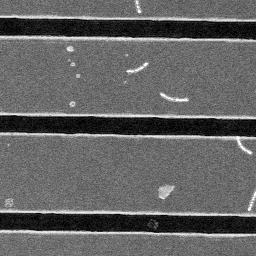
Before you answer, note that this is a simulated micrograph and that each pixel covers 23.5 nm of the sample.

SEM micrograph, lines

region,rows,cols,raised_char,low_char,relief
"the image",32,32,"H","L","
HHHHHHHHHHHHHHHHHHHHHHHHHHHHHHHH
HHHHHHHHHHHHHHHHHHHHHHHHHHHHHHHH
LLLLLLLLLLLLLLLLLLLLLLLLLLHHHHHH
LLLLLLLLLLLLLLLLLLLLLLLLLLLLLLLL
LLLLLLLLLLLLLLLLLLLLLLLLLLLLLLLL
HHHHHHHHHHHHHHHHHHHHHHHHHHHHHHHH
HHHHHHHHHHHHHHHHHHHHHHHHHHHHHHHH
HHHHHHHHHHHHHHHHHHHHHHHHHHHHHHHH
HHHHHHHHHHHHHHHHHHHHHHHHHHHHHHHH
HHHHHHHHHHHHHHHHHHHHHHHHHHHHHHHH
HHHHHHHHHHHHHHHHHHHHHHHHHHHHHHHH
HHHHHHHHHHHHHHHHHHHHHHHHHHHHHHHH
HHHHHHHHHHHHHHHHHHHHHHHHHHHHHHHH
HHHHHHHHHHHHHHHHHHHHHHHHHHHHHHHH
LLLLLLLLLLLLLHHHHHHHHHHHHHHHHHHH
LLLLLLLLLLLLLLLLLLLLLLLLLLLLLLLL
LLLLLLLLLLLLLLLLLLLLLLLLLLLLLLLL
HHHHHHHHHHHHHHHHHHHHHHHHHHHHHHHH
HHHHHHHHHHHHHHHHHHHHHHHHHHHHHHHH
HHHHHHHHHHHHHHHHHHHHHHHHHHHHHHHH
HHHHHHHHHHHHHHHHHHHHHHHHHHHHHHHH
HHHHHHHHHHHHHHHHHHHHHHHHHHHHHHHH
HHHHHHHHHHHHHHHHHHHHHHHHHHHHHHHH
HHHHHHHHHHHHHHHHHHHHHHHHHHHHHHHH
HHHHHHHHHHHHHHHHHHHHHHHHHHHHHHHH
HHHHHHHHHHHHHHHHHHHHHHHHHHHHHHHH
LHHHHHHHHHHHHHHHHHHHHHHHHHHHHHHH
LLLLLLLLLLLLLLLLLLLLLLLLLLLLLLLL
LLLLLLLLLLLLLLLLLLLLLLLLLLLLLLLL
HHHHHHHHHHHHHHHHHHHHHHHHHHHHHHHH
HHHHHHHHHHHHHHHHHHHHHHHHHHHHHHHH
HHHHHHHHHHHHHHHHHHHHHHHHHHHHHHHH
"